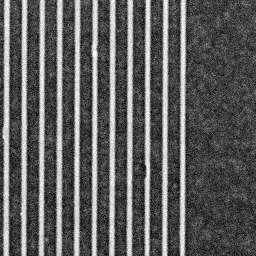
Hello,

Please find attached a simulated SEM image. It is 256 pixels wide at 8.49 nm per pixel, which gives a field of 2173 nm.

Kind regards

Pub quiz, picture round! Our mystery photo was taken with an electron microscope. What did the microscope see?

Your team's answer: parallel lines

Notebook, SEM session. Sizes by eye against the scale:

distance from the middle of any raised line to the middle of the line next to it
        150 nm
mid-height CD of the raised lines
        32.9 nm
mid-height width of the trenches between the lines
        0.114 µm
